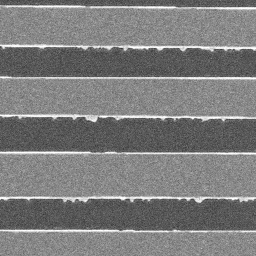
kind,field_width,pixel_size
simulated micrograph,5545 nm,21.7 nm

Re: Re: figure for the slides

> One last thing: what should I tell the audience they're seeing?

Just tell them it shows lines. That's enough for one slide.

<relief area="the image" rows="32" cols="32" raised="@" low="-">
--------------------------------
@@@@@@@@@@@@@@@@@@@@@@@@@@@@@@@@
@@@@@@@@@@@@@@@@@@@@@@@@@@@@@@@@
@@@@@@@@@@@@@@@@@@@@@@@@@@@@@@@@
@@@@@@@@@@@@@@@@@@@@@@@@@@@@@@@@
@@@@@@@@@@@@@@@@@@@@@@@@@@@@@@@@
--------------------------------
--------------------------------
--------------------------------
--------------------------------
@@@@@@@@@@@@@@@@@@@@@@@@@@@@@@@@
@@@@@@@@@@@@@@@@@@@@@@@@@@@@@@@@
@@@@@@@@@@@@@@@@@@@@@@@@@@@@@@@@
@@@@@@@@@@@@@@@@@@@@@@@@@@@@@@@@
--@-@@@@@@@@@@@@@@@@@@@@@@@@@@@@
--------------------------------
--------------------------------
--------------------------------
--------------------------------
@@@@@@@@@@@@@@@@@@@@@@@@@@@@@@@@
@@@@@@@@@@@@@@@@@@@@@@@@@@@@@@@@
@@@@@@@@@@@@@@@@@@@@@@@@@@@@@@@@
@@@@@@@@@@@@@@@@@@@@@@@@@@@@@@@@
@@@@@@@@@@@@@@@@@@@@@@@@@@@@@@@@
@@@@@@@@@@@@@@@@@@@@@@@@@@@@@@@@
--------------------------------
--------------------------------
--------------------------------
--------------------------------
@@@@@@@@@@@@@@@@@@@@@@@@@@@@@@@@
@@@@@@@@@@@@@@@@@@@@@@@@@@@@@@@@
@@@@@@@@@@@@@@@@@@@@@@@@@@@@@@@@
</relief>